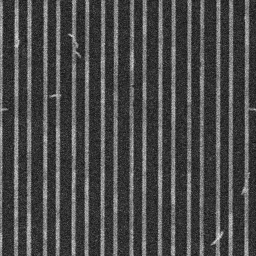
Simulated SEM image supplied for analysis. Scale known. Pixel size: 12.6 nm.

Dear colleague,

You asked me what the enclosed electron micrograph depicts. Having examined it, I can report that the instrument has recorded parallel lines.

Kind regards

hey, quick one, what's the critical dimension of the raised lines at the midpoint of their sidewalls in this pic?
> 0.0408 microns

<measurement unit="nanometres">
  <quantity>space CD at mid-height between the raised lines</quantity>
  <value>156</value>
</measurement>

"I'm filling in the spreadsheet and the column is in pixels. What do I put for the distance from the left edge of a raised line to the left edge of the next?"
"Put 14.4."